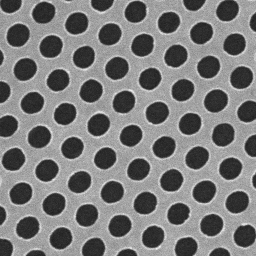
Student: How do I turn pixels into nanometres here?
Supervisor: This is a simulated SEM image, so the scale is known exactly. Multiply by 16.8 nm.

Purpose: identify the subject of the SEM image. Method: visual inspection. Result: a regular array of holes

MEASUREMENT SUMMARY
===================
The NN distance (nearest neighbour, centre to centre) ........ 34.2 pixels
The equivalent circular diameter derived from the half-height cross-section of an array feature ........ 0.389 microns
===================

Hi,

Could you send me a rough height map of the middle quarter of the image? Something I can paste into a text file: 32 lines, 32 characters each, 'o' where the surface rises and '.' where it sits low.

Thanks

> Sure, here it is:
ooo....ooo......oooooooooo...ooo
oooooooooo......oooo...ooooooooo
.ooooooooo......ooo.....oooooooo
.oooooooooo....oooo.....oooooooo
.oooo....oooooooooo.....oooo....
.ooo......ooooooooo....oooo.....
oooo......ooooooooooo.ooooo.....
oooo......ooo....oooooooooo.....
oooo.....ooo......ooooooooo.....
oooooo..oooo......ooooo..ooooooo
...ooooooooo......ooo.....oooooo
...oooooooooo....oooo.....oooooo
...ooooo..oooooooooo......oooo..
...oooo....oooooooooo.....ooo...
..oooo.....oooooooooo....oooo...
oooooo......oooo..ooooooooooo...
oooooo.....ooo.....oooooooooo...
ooooooo...oooo......oooooooooo..
o...oooooooooo......oooo...ooooo
.....ooooooooo.....oooo.....oooo
.....oooooooooo...oooo......oooo
.....oooo...oooooooooo......ooo.
....oooo.....oooooooooo....oooo.
...ooooo.....ooooooooooo..oooo..
ooooooo......oooo....ooooooooo..
oooooooo....oooo......ooooooooo.
oooooooooooooooo......oooo..oooo
oo....oooooooooo.....oooo....ooo
o......ooooooooo....oooo......oo
o......oooo..ooooooooooo......oo
o......ooo.....ooooooooo.....ooo
oo....ooo......oooooooooo...oooo